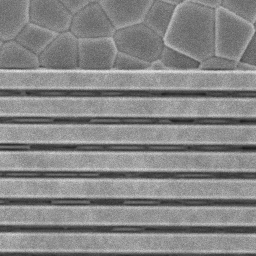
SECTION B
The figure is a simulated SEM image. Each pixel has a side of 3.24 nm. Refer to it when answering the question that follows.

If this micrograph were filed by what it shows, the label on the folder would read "parallel lines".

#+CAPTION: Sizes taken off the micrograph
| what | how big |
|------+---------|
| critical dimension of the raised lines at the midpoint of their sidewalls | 59.1 nanometres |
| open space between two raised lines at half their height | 0.0279 microns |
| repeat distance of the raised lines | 87.9 nm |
